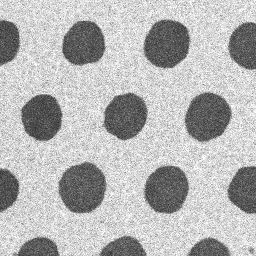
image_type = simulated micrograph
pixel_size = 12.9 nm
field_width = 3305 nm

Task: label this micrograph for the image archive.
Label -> holes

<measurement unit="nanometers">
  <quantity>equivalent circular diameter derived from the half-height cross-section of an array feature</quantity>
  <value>589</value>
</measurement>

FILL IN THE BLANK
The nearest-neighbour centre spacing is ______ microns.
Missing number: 1.06